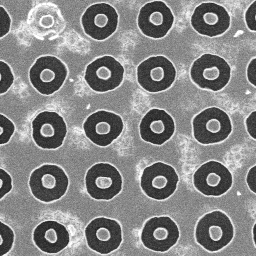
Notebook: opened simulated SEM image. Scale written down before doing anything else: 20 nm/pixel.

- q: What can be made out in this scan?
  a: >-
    a regular array of ring-shaped grooves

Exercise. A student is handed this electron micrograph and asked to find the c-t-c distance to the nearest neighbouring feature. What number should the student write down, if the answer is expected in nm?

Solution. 1050